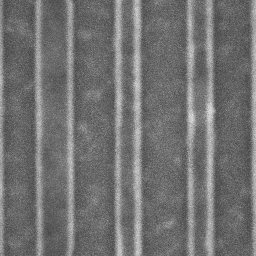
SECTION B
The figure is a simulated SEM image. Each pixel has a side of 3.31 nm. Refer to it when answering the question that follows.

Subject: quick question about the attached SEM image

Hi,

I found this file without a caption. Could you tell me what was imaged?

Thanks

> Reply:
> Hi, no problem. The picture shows one or a few lines or trenches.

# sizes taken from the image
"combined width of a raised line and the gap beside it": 242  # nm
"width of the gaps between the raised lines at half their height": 145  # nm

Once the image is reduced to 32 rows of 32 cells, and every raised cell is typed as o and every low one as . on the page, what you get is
.....oooo......oo.......oo......
.....oooo......oo.......oo......
.....oooo......ooo......oo......
.....oooo......ooo......oo......
.....oooo......oo.......oo......
.....oooo.....ooo.......oo......
.....oooo......oo.......oo......
.....oooo......oo.......oo......
.....oooo......oo.......oo......
.....oooo......oo.......oo......
.....oooo......oo.......oo......
.....oooo......oo.......oo......
.....oooo......oo.......oo......
.....oooo......oo.......ooo.....
.....oooo......oo.......ooo.....
.....oooo......oo.......oo......
.....oooo......oo.......oo......
.....oooo......oo.......oo......
.....oooo......oo.......oo......
.....oooo......oo.......oo......
.....oooo......oo.......oo......
.....oooo......oo.......oo......
.....oooo......oo.......oo......
.....oooo......oo.......oo......
.....oooo......oo.......oo......
.....oooo......oo.......oo......
.....oooo......oo.......oo......
.....oooo......oo.......oo......
.....oooo......oo.......oo......
.....oooo......ooo......oo......
.....oooo......ooo......oo......
.....oooo......ooo......oo......